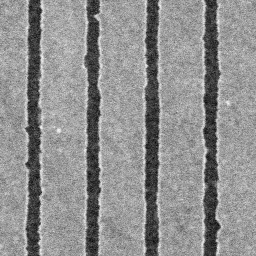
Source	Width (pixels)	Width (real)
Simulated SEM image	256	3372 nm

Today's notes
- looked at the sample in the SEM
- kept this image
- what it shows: parallel lines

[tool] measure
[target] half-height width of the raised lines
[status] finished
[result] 594 nm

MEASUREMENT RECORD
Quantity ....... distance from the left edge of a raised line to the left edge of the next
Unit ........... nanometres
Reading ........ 775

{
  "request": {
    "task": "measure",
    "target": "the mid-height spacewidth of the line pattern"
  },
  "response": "186 nanometers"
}